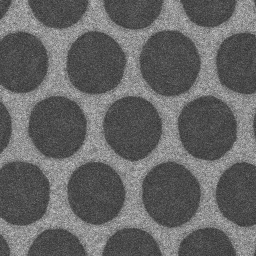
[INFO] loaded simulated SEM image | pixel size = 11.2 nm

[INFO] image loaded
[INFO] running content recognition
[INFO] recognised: holes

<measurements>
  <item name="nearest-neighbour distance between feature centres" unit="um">0.834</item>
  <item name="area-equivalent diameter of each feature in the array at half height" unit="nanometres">691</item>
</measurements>